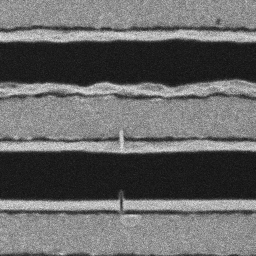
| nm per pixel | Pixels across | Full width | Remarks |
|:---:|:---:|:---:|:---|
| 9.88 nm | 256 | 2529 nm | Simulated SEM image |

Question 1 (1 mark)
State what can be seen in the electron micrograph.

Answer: one or a few lines or trenches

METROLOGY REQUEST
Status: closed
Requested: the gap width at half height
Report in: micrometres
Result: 0.567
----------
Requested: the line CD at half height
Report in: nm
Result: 563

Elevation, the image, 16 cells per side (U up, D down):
DDDDDDDDDDDDDDDD
DDDDDDDDDDDDDDDD
UUUUUUUUUUUUUUUU
UUUUUUUUUUUUUUUU
UUUUUUUUUUUUUUUU
UUUDUUUUUUUUUDDU
DDDDDDDDDDDDDDDD
DDDDDDDDDDDDDDDD
DDDDDDDDDDDDDDDD
UUUUUUUUUUUUUUUU
UUUUUUUUUUUUUUUU
UUUUUUUUUUUUUUUU
UUUUUUUUUUUUUUUU
DDDDDDDDDDDDDDDD
DDDDDDDDDDDDDDDD
DDDDDDDDDDDDDDDD